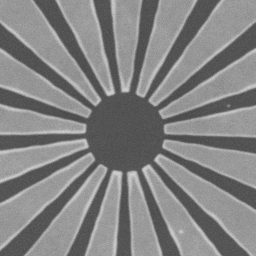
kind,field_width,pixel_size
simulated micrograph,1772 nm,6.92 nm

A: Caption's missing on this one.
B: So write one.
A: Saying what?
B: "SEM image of groups of lines, slits or small figures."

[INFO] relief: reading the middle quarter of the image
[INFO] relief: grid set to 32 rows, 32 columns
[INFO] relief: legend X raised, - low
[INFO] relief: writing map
XXXX---XXXX---XXX---XXXX----XXXX
XXXX---XXXX---XXX---XXX----XXXXX
XXXXX---XXX---XXX--XXXX---XXXXXX
XXXXX---XXX---XXX--XXX---XXXXXX-
--XXXX---XXX--XXX--XXX---XXXXX--
---XXXX---XX---X---XX---XXXXX---
---XXXX---XX---X--XXX--XXXXX----
X----XXX-----------X--XXXX----XX
XX----XXX------------XXXX----XXX
XXXX---XX------------XXX---XXXXX
XXXXX---------------------XXXXXX
XXXXXXX-----------------XXXXXXX-
---XXX------------------XXXXX---
-------------------------X------
XXX--------------------------XXX
XXXXX--------------------XXXXXXX
XXXXX--------------------XXXXXXX
-------------------------------X
--------------------------------
-XXXX--------------------XXXX---
XXXXXX-------------------XXXXXXX
XXXX----------------------XXXXXX
X---------------------------XXXX
-----XX----------------XXX----XX
---XXXX----------------XXXX-----
-XXXXX---X--------------XXXXX---
XXXXX---XXX---------XX---XXXXXX-
XXXX---XXX--XX---X--XXX---XXXXXX
XXX---XXXX--XX--XX---XXX---XXXXX
XX----XXX--XXX--XXX--XXXX---XXXX
X----XXXX--XXX--XXX---XXX----XXX
----XXXX---XXX--XXX---XXXX----XX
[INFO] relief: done